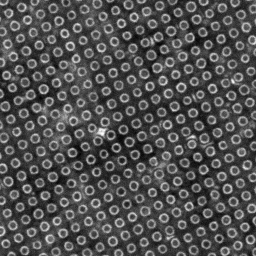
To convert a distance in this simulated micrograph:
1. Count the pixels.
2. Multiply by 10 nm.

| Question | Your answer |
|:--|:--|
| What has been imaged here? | a regular array of raised bodies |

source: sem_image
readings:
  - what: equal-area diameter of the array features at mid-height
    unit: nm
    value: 83.2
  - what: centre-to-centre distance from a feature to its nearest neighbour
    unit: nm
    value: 137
